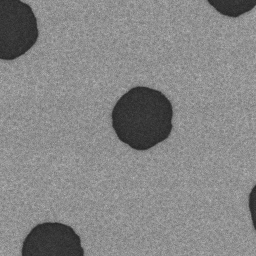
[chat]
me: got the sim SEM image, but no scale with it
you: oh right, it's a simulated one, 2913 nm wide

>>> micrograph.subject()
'holes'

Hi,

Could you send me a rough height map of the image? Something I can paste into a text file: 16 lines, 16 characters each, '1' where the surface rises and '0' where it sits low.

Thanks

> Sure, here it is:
0011111111111000
0011111111111111
0011111111111111
0111111111111111
1111111111111111
1111111101111111
1111111000011111
1111111000011111
1111111000111111
1111111111111111
1111111111111111
1111111111111111
1111111111111111
1111111111111111
1100011111111111
1000011111111111